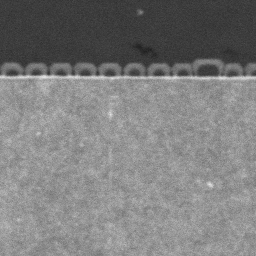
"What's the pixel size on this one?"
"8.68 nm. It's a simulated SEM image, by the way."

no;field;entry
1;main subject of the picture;wiring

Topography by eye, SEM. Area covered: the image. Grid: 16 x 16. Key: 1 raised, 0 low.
0000000000000000
0000000000000000
0000000000000000
0000000000000000
0000000000000000
1111111111111111
1111111111111111
1111111111111111
1111111111111111
1111111111111111
1111111111111111
1111111111111111
1111111111111111
1111111111111111
1111111111111111
1111111111111111